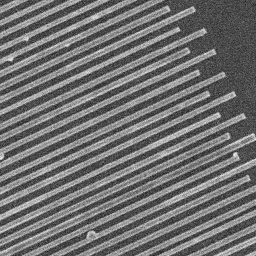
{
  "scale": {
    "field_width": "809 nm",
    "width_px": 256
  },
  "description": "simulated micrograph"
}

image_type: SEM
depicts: parallel lines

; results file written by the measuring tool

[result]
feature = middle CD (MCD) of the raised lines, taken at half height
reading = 16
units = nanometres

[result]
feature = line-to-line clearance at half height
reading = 20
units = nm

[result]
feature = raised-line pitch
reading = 37.1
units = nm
